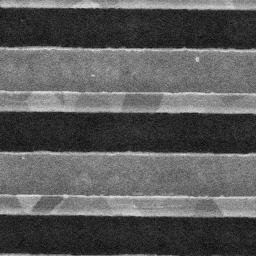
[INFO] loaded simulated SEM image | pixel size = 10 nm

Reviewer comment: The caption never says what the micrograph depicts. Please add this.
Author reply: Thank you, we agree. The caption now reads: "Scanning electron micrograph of lines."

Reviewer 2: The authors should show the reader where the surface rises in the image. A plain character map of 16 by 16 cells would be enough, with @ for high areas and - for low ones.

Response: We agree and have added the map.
----------@@@@@@
----------------
----------------
@@@@@@@@@@@@@@@@
@@@@@@@@@@@@@@@@
@@@@@@@@@@@@@@@@
@@@@@@@@@@@@@@@@
----------------
----------------
----------------
@@@@@@@@@@@@@@@@
@@@@@@@@@@@@@@@@
@@@@@@@@@@@@@@@@
---------------@
----------------
----------------